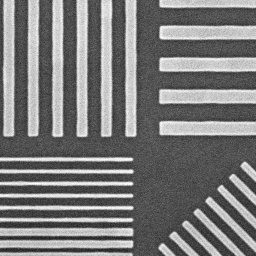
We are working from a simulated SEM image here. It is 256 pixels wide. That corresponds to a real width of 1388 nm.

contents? groups of lines, slits or small figures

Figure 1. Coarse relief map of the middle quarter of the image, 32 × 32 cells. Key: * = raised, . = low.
...***...***...***......********
...***....**....**......********
...***....**....**..............
...***....**....**..............
...***....**...***..............
...***...***...***..............
...***...***...***..............
...***...***...***......********
...***...***....**......********
...***....**....**......********
...***....**....**..............
...***....**....**..............
...***....**....**..............
...***....**....**..............
...***....**....**..............
...***....**....**......********
...***....**...***......********
...***...***...***........*****.
................................
................................
................................
................................
................................
................................
................................
................................
................................
................................
................................
................................
................................
................................